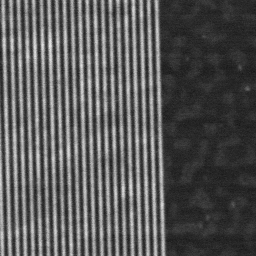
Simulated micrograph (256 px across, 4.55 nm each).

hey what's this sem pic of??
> parallel lines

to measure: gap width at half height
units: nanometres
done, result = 25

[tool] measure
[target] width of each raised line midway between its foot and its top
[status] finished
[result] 0.0108 micrometres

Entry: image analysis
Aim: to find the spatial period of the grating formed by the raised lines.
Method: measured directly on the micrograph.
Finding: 34.9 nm